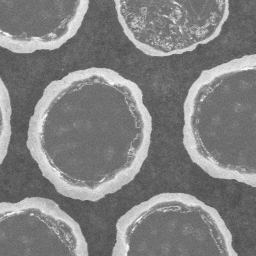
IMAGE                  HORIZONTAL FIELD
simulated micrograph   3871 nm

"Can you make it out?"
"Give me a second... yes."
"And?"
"raised bodies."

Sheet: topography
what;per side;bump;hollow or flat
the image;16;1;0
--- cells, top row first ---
1111100000011100
1111100000001100
1111000000001000
0000000000000000
0000000000000011
0001111100001111
0001111110001111
0011111110001111
0011111110001111
0011111110001111
0001111100000111
0000111000000000
0000000000110000
1111000011111000
1111100011111100
1111100011111100